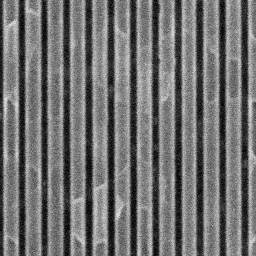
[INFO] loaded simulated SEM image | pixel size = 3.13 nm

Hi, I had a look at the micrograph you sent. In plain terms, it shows parallel lines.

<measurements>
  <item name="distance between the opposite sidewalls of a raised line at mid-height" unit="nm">45.8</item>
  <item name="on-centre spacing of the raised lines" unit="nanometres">69.7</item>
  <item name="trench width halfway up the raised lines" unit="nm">25.4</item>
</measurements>